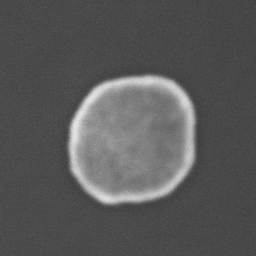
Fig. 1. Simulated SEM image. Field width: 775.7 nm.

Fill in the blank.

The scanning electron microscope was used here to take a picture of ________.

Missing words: raised bodies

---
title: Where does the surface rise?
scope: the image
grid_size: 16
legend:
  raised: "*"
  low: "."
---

................
................
................
................
................
......*****.....
.....*******....
.....*******....
.....*******....
.....*******....
.....*******....
.....******.....
................
................
................
................